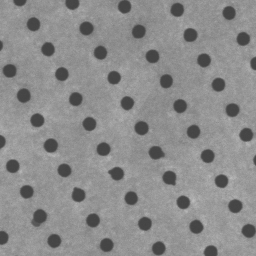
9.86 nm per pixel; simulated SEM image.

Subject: a regular array of holes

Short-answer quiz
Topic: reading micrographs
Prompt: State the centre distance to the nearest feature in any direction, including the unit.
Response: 28.3 pixels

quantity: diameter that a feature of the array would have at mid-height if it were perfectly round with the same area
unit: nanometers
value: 138